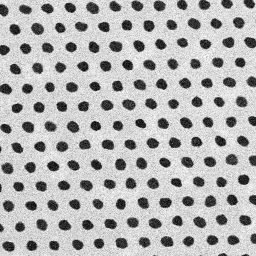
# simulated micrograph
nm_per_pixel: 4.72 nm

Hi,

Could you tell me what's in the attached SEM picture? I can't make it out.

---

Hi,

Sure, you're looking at a regular array of holes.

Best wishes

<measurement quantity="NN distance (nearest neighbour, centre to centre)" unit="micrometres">0.103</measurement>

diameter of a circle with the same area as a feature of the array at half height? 52.5 nanometres